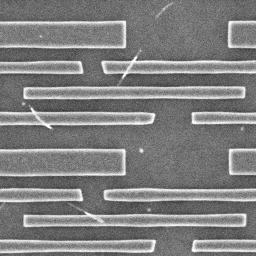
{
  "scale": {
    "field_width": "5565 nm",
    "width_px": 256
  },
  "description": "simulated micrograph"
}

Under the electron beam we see wiring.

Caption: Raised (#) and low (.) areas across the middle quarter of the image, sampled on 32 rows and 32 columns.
####......######################
#####.....######################
...............#................
................................
................................
................................
################################
################################
#######.........................
................................
................................
................................
######################..........
#######################.........
######################..........
................................
................................
................................
................................
................................
................................
###############.................
###############.................
###############.................
###############.................
###############.................
###############.................
###############.................
................................
................................
................................
####........####################